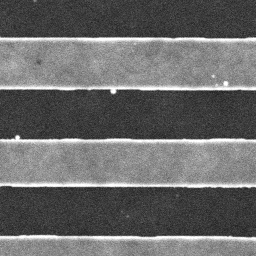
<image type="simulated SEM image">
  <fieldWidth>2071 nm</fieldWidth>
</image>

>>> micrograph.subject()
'lines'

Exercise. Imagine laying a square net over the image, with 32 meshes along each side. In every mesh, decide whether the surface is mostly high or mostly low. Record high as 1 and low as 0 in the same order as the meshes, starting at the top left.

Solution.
00000000000000000000000000000000
00000000000000000000000000000000
00000000000000000000000000000000
00000000000000000000000000000000
00000000000000000000000000000000
11111111111111111111111111111111
11111111111111111111111111111111
11111111111111111111111111111111
11111111111111111111111111111111
11111111111111111111111111111111
11111111111111111111111111111111
00000000000000000000000000000000
00000000000000000000000000000000
00000000000000000000000000000000
00000000000000000000000000000000
00000000000000000000000000000000
00000000000000000000000000000000
00000001110001111000000000111000
11111111111111111111111111111111
11111111111111111111111111111111
11111111111111111111111111111111
11111111111111111111111111111111
11111111111111111111111111111111
00000000000000000000000000000000
00000000000000000000000000000000
00000000000000000000000000000000
00000000000000000000000000000000
00000000000000000000000000000000
00000000000000000000000000000000
00111110000000000000000000000000
11111111111111111111111111111111
11111111111111111111111111111111